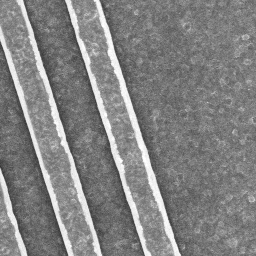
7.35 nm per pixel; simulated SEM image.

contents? one or a few lines or trenches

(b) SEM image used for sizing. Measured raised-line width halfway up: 217 nm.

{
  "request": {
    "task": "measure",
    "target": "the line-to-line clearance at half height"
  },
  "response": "315 nanometres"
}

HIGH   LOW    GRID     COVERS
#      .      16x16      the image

#...##..........
##...##.........
##...##.........
##...##.........
.##...#.........
.##...##........
.##...##........
..##...#........
..##...##.......
..##...##.......
...##..##.......
...##...##......
...##...##......
#...##..##......
#...##...##.....
#...##...##.....